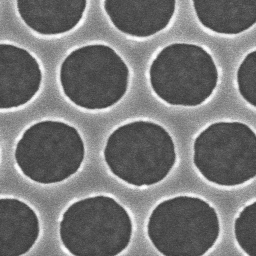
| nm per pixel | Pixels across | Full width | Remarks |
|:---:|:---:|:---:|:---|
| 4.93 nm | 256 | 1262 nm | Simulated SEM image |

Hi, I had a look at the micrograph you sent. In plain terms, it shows holes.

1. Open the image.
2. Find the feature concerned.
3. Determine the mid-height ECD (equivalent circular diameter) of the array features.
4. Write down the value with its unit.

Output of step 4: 328 nm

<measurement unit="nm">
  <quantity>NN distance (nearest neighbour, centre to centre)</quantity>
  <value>434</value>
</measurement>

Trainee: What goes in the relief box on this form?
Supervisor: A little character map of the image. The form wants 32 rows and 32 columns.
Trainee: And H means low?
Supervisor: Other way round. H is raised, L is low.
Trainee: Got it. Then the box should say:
HHLLLLLLLLLHHLLLLLLLLLHHLLLLLLLL
HHLLLLLLLLHHHLLLLLLLLLHHLLLLLLLL
HHHLLLLLLLHHHHLLLLLLLHHHHLLLLLLL
HHHHLLLLLHHHHHHLLLLLLHHHHHLLLLLH
HHHHHHHHHHHHHHHHLLLHHHHHHHHHHHHH
LHHHHHHHHHHHHHHHHHHHHLLLHHHHHHHH
LLLLHHHHHLLLLLHHHHHHLLLLLLHHHHHL
LLLLHHHHLLLLLLLHHHHLLLLLLLLHHHLL
LLLLLHHHLLLLLLLLHHHLLLLLLLLHHHLL
LLLLLHHLLLLLLLLLHHHLLLLLLLLHHHLL
LLLLLHHHLLLLLLLLHHHLLLLLLLLHHHLL
LLLLLHHHLLLLLLLLHHHLLLLLLLLHHHLL
LLLLHHHHHLLLLLLHHHHHLLLLLLHHHHHL
LHHHHHHHHHHLLHHHHHHHHHHHHHHHHHHH
HHHHHHHHHHHHHHHHHHHHHHHHHHHHHHHH
HHHHLLLLHHHHHHHHLLLLHHHHHHHLLLLH
HHHLLLLLLLHHHHLLLLLLLHHHHLLLLLLL
HHLLLLLLLLHHHLLLLLLLLLHHLLLLLLLL
HHLLLLLLLLLHHLLLLLLLLLHHLLLLLLLL
HHLLLLLLLLHHHLLLLLLLLLHHLLLLLLLL
HHLLLLLLLLHHHLLLLLLLLLHHLLLLLLLL
HHHLLLLLLHHHHHLLLLLLLHHHHLLLLLLL
HHHHLLLLHHHHHHHLLLLLHHHHHHLLLLLH
HHHHHHHHHHHHHHHHHHHHHHHHHHHHHHHH
HHHHHHHHHHHHLHHHHHHHHHHHHHHHHHHH
LLLHHHHHHLLLLLLHHHHHLLLLLLHHHHHL
LLLLHHHHLLLLLLLLHHHLLLLLLLLHHHLL
LLLLLHHHLLLLLLLLHHHLLLLLLLLHHLLL
LLLLLHHLLLLLLLLLHHLLLLLLLLLHHLLL
LLLLLHHLLLLLLLLLHHHLLLLLLLLHHLLL
LLLLHHHHLLLLLLLLHHHLLLLLLLLHHHLL
LLLHHHHHHLLLLLLHHHHHLLLLLLHHHHHL